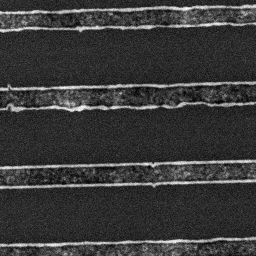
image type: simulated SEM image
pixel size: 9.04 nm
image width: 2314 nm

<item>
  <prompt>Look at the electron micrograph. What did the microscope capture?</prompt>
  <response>one or a few lines or trenches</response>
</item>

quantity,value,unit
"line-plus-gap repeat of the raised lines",0.705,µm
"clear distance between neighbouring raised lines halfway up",0.521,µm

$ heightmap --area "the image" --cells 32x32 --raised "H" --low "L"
LLLLLLLLLLLLLLLLLLLLLLLLLLLLLLLL
LLLLHLLHHHHHHHHHHHHHHHHHHHHHHHHH
HHHHHHHHHHHHHHHHHHHHHHHHHHHHHHHH
HHHHLHHHHHHHLLLLLLLLLLLLLLLLLLLL
LLLLLLLLLLLLLLLLLLLLLLLLLLLLLLLL
LLLLLLLLLLLLLLLLLLLLLLLLLLLLLLLL
LLLLLLLLLLLLLLLLLLLLLLLLLLLLLLLL
LLLLLLLLLLLLLLLLLLLLLLLLLLLLLLLL
LLLLLLLLLLLLLLLLLLLLLLLLLLLLLLLL
LLLLLLLLLLLLLLLLLLLLLLLLLLLLLLLL
LLLLLLLLLLLLLLLLLLLLLLLLHHHHHHHH
HHHHHHHHHHHHHHHHHHHHHHHHHHHHHHHH
HHHHHHHHHHHHHHHHHHHHHHHHHHHHHHHH
HHLHHHLLHHHLLHLLLHHLLLLLLLLLLLLL
LLLLLLLLLLLLLLLLLLLLLLLLLLLLLLLL
LLLLLLLLLLLLLLLLLLLLLLLLLLLLLLLL
LLLLLLLLLLLLLLLLLLLLLLLLLLLLLLLL
LLLLLLLLLLLLLLLLLLLLLLLLLLLLLLLL
LLLLLLLLLLLLLLLLLLLLLLLLLLLLLLLL
LLLLLLLLLLLLLLLLLLLLLLLLLLLLLLLL
LLLLLLLLLLLLLLLLLLHLHHHHHHHHHHHH
HHHHHHHHHHHHHHHHHHHHHHHHHHHHHHHH
HHHHHHHHHHHHHHHHHHHHHHHHHHHHHHHH
LLLLLLLLLLLLLLLLLLLLLLLLLLLLLLLL
LLLLLLLLLLLLLLLLLLLLLLLLLLLLLLLL
LLLLLLLLLLLLLLLLLLLLLLLLLLLLLLLL
LLLLLLLLLLLLLLLLLLLLLLLLLLLLLLLL
LLLLLLLLLLLLLLLLLLLLLLLLLLLLLLLL
LLLLLLLLLLLLLLLLLLLLLLLLLLLLLLLL
LLLLLLLLLLLLLLLLLLLLLLLLLLLLLLLL
LLLLLLLLHLHHHHHHHHHHHHHHHHHHHHHH
HHHHHHHHHHHHHHHHHHHHHHHHHHHHHHHH